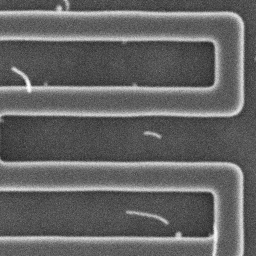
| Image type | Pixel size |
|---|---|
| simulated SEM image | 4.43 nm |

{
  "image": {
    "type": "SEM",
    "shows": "groups of lines, slits or small figures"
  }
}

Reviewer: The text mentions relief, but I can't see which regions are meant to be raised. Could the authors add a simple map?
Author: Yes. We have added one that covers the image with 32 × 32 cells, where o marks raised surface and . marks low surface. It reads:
................................
....o...........................
oooooooooooooooooooooooooooooo..
oooooooooooooooooooooooooooooo..
oooooooooooooooooooooooooooooo..
...........................ooo..
...........................ooo..
...........................ooo..
...........................ooo..
...........................ooo..
...........................ooo..
oooooooooooooooooooooooooooooo..
oooooooooooooooooooooooooooooo..
oooooooooooooooooooooooooooooo..
................................
................................
................................
................................
................................
................................
ooooooooooooooooooooooooooooo...
oooooooooooooooooooooooooooooo..
oooooooooooooooooooooooooooooo..
oooooooooooooooooooooooooooooo..
...........................ooo..
...........................ooo..
...........................ooo..
...........................ooo..
...........................ooo..
..........................oooo..
oooooooooooooooooooooooooooooo..
oooooooooooooooooooooooooooooo..